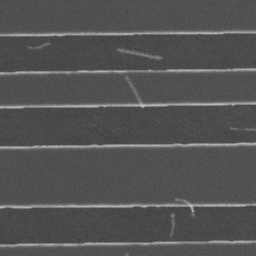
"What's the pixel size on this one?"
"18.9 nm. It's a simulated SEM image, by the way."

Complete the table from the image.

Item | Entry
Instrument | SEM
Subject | lines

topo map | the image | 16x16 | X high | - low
XXXXXXXXXXXXXXXX
XXXXXXXXXXXXXXXX
----------------
----------------
-----XXXXXXXXXXX
XXXXXXXXXXXXXXXX
XXXXXXXXXXXXXX--
----------------
----------------
XXXXXXXXXXXXXXXX
XXXXXXXXXXXXXXXX
XXXXXXXXXXXXXXXX
XXXXXXXXXXXXXXXX
----------------
----------------
XXXXXXXXXXXXXXXX